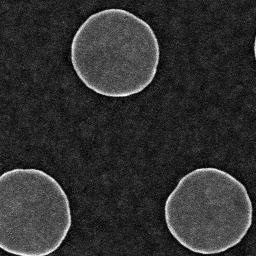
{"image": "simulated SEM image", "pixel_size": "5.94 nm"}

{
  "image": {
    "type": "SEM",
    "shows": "raised bodies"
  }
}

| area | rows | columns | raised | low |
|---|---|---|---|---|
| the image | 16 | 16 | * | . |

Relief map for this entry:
................
.....****.......
.....*****......
.....*****......
.....*****......
......***.......
................
................
................
................
................
****.......****.
****.......*****
****......******
****.......****.
***.........**..